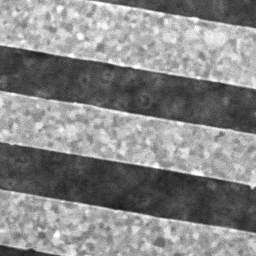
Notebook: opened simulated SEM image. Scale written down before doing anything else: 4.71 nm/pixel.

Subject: one or a few lines or trenches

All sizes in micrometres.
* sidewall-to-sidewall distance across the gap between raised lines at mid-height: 0.22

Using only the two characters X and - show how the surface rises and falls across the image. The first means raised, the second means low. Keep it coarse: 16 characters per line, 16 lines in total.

XXXXXXXX--------
XXXXXXXXXXXXXX--
XXXXXXXXXXXXXXXX
----XXXXXXXXXXXX
----------XXXXXX
----------------
XXXXX-----------
XXXXXXXXXX------
XXXXXXXXXXXXXXXX
----XXXXXXXXXXXX
----------XXXXXX
---------------X
XXXX------------
XXXXXXXXX-------
XXXXXXXXXXXXXXX-
-XXXXXXXXXXXXXXX